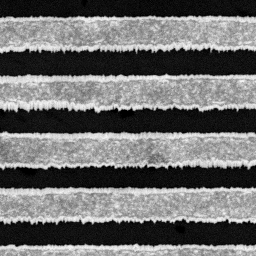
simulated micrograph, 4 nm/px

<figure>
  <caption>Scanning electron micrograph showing lines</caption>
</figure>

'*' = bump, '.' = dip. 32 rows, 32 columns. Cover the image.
................................
................................
********************************
********************************
********************************
********************************
................................
................................
................................
.......................***...*..
********************************
********************************
********************************
..........*.**.**..**..*.*.*.*..
................................
................................
................................
********************************
********************************
********************************
************************.*****.*
................................
................................
................................
********************************
********************************
********************************
**.*****..***...**.***.*****.***
................................
................................
................................
********************************